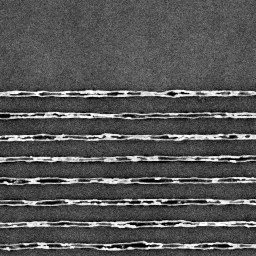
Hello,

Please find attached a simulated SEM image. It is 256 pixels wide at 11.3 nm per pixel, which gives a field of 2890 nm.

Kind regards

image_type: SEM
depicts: parallel lines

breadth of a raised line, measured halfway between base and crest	57.8	nm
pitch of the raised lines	246	nm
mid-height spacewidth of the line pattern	0.195	µm